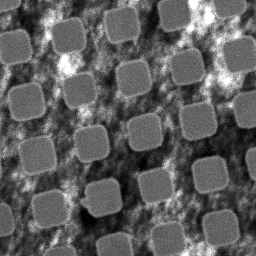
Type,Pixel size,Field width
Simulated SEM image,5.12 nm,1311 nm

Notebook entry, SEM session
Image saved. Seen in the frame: a regular array of raised bodies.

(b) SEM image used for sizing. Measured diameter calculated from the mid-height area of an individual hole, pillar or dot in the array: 186 nanometers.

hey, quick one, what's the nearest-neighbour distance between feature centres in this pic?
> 0.28 um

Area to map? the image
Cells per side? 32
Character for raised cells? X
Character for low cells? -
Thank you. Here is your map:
XX------------------XXXX--XXXXX-
-------------XXXX---XXXX---XXX--
--------XX---XXXX---XXXX--------
------XXXX---XXXX---XX----------
XXX---XXXXX--XXXX---------------
XXXX---XXXX-----------------XXXX
XXXX---XX--------------XX---XXXX
XXX------------------XXXX---XXXX
---------------XXX---XXXXX--XXXX
---------XX----XXXX---XXX-------
---XX---XXXX---XXXX---X---------
-XXXX---XXXX---XXX-------------X
-XXXX---XXXX-----------------XXX
-XXXXX-----------------XXXX--XXX
--XXX-------------XX---XXXX--XXX
----------------XXXX---XXXX---XX
----------XXX---XXXX---XXXX-----
---XXX---XXXX---XXXX------------
--XXXXX---XXXX---XX-------------
--XXXXX---XXX------------------X
---XXXX-----------------XXXX---X
---XXX------------XXX---XXXX---X
-------------X---XXXX---XXXX----
-----------XXXX--XXXXX---XXX----
----XXXX---XXXX---XXXX----------
----XXXX--XXXXX-----------------
X---XXXXX--XXX-------------XX---
XX--XXXX-----------------XXXXX--
XX-----------------XXXX---XXXX--
-------------XXX---XXXX---XXXX--
------------XXXX---XXXX---XXX---
------XXX---XXXX---XXXX---------